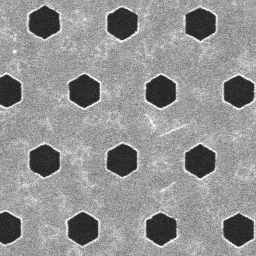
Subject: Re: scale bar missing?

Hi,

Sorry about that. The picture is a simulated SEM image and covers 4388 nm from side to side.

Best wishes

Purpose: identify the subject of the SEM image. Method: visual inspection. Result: a regular array of holes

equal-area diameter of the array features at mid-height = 545 nm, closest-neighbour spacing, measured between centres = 77.5 px